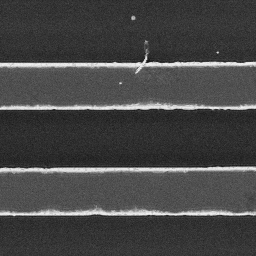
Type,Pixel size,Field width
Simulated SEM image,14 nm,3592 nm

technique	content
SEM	lines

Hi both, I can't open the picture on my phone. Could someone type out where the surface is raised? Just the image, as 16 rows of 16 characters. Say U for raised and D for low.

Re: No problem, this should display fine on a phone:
DDDDDDDDDDDDDDDD
DDDDDDDDDDDDDDDD
DDDDDDDDDDDDDDDD
DDDDDDDDDDDDDDDD
UUUUUUUUUUUUUUUU
UUUUUUUUUUUUUUUU
UUUUUUUUUUUUUUUU
DDDDDDDDDDDDDDDD
DDDDDDDDDDDDDDDD
DDDDDDDDDDDDDDDD
DDDDDDDDDDDDDDUU
UUUUUUUUUUUUUUUU
UUUUUUUUUUUUUUUU
DDDDDDDDDDDDDDDD
DDDDDDDDDDDDDDDD
DDDDDDDDDDDDDDDD